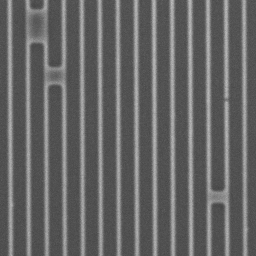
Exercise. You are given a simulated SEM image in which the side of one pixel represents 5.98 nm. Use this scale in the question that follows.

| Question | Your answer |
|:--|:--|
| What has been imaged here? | parallel lines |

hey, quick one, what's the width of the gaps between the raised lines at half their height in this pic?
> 0.0919 µm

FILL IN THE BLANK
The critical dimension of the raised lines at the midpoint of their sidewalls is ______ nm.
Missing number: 16.4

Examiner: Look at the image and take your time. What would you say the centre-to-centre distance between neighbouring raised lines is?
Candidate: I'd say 18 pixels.